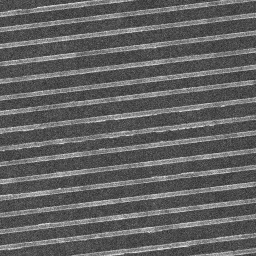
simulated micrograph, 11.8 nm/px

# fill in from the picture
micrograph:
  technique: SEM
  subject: parallel lines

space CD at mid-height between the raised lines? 153 nm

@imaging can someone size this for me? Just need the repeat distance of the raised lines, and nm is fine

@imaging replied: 198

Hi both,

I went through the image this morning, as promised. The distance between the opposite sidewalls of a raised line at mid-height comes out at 44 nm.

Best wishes